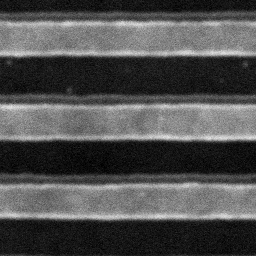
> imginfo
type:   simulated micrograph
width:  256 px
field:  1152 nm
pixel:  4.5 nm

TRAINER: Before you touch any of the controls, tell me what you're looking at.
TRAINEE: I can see lines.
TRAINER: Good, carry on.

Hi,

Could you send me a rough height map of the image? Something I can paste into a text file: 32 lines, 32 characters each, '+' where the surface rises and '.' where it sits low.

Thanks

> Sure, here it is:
................................
................................
................................
++++++++++++++++++++++++++++++++
++++++++++++++++++++++++++++++++
++++++++++++++++++++++++++++++++
++++++++++++++++++++++++++++++++
................................
................................
................................
................................
................................
................................
++++++++++++++++++++++++++++++++
++++++++++++++++++++++++++++++++
++++++++++++++++++++++++++++++++
++++++++++++++++++++++++++++++++
................................
................................
................................
................................
................................
................................
++++++++++++++++++++++++++++++++
++++++++++++++++++++++++++++++++
++++++++++++++++++++++++++++++++
++++++++++++++++++++++++++++++++
................................
................................
................................
................................
................................